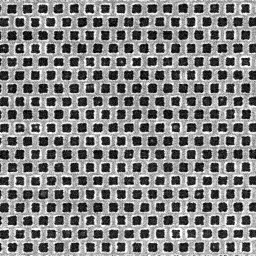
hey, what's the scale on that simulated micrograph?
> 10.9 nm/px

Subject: a regular array of holes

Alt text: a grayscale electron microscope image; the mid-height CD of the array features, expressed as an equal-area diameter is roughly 120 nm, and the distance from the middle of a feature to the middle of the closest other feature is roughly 165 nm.